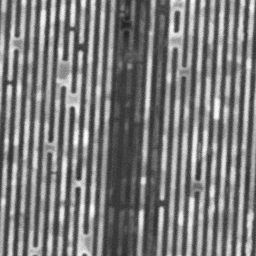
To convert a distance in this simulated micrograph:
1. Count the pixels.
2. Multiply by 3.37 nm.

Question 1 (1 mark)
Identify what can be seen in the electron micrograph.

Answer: parallel lines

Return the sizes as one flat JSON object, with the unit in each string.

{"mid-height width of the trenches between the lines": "0.0223 micrometres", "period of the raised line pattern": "9.91 px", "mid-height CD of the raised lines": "0.0097 micrometres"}